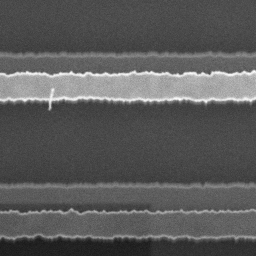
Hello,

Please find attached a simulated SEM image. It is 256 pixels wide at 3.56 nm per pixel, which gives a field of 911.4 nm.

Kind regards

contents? lines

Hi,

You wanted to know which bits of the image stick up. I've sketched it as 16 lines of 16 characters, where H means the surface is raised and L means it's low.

LLLLLLLLLLLLLLLL
LLLLLLLLLLLLLLLL
LLLLLLLLLLLLLLLL
HHHHHHHHHHHHHHHH
HHHHHHHHHHHHHHHH
HHHHHHHHHHHHHHHH
LLLLLLLLLLLLLLLL
LLLLLLLLLLLLLLLL
LLLLLLLLLLLLLLLL
LLLLLLLLLLLLLLLL
LLLLLLLLLLLLLLLL
LLLLLLLLLLLLLLLL
HHHHHHHHHHHHHHHH
HHHHHHHHHHHHHHHH
HHHHHHHHHHHHHHHH
LLLLLLLLLLLLLLLL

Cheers